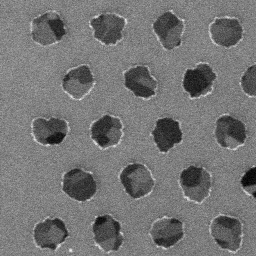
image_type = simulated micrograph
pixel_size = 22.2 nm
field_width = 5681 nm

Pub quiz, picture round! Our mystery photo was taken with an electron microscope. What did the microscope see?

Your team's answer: a regular array of raised bodies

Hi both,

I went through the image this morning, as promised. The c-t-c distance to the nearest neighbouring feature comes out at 1260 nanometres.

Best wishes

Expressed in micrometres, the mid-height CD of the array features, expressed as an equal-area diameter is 0.743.